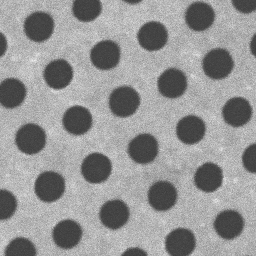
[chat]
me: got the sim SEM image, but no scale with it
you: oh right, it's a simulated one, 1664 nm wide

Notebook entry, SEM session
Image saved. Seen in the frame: a regular array of holes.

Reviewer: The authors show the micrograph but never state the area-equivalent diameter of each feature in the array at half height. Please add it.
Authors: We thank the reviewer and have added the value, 0.198 microns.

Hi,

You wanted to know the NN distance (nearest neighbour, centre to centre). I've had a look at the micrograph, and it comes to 326 nanometers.